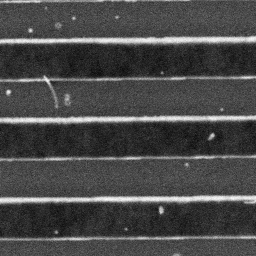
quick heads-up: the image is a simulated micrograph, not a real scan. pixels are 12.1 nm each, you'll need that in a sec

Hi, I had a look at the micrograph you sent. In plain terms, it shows lines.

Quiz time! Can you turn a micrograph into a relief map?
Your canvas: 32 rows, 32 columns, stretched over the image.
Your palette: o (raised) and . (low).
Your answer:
................................
................................
................................
................................
................................
oooooooooooooooooooooooooooooooo
oooooooooooooooooooooooooooooooo
oooooooooooooooooooooooooooooooo
oooooooooooooooooooooooooooooooo
oooooooooooooooooooooooooooooooo
................................
................................
................................
................................
................................
oooooooooooooooooooooooooooooooo
oooooooooooooooooooooooooooooooo
oooooooooooooooooooooooooooooooo
oooooooooooooooooooooooooooooooo
oooooooooooooooooooooooooooooooo
................................
................................
................................
................................
................................
oooooooooooooooooooooooooooooooo
oooooooooooooooooooooooooooooooo
oooooooooooooooooooooooooooooooo
oooooooooooooooooooooooooooooooo
oooooooooooooooooooooooooooooooo
................................
................................